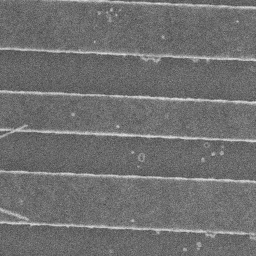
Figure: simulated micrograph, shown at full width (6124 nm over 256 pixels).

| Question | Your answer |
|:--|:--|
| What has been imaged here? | lines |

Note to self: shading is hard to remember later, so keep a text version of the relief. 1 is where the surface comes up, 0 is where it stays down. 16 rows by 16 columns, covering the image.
1111111111111111
1111111111111111
1111111111111111
0000000001111111
0000000000000000
0000000000000000
1111111111111111
1111111111111111
0000000001111111
0000000000000000
0000000000000000
1111111111111111
1111111111111111
1111111111111111
0000000000000111
0000000000000000